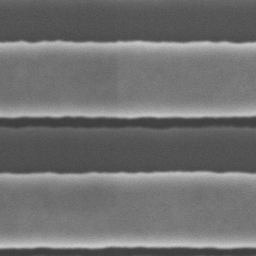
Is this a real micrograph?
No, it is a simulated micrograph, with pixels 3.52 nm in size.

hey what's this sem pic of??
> lines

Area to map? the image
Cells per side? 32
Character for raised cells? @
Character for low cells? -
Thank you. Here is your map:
--------------------------------
--------------------------------
--------------------------------
--------------------------------
--------------------------------
@@@@@@@@@@@@@@@@@@@@@@@@@@@@@@@@
@@@@@@@@@@@@@@@@@@@@@@@@@@@@@@@@
@@@@@@@@@@@@@@@@@@@@@@@@@@@@@@@@
@@@@@@@@@@@@@@@@@@@@@@@@@@@@@@@@
@@@@@@@@@@@@@@@@@@@@@@@@@@@@@@@@
@@@@@@@@@@@@@@@@@@@@@@@@@@@@@@@@
@@@@@@@@@@@@@@@@@@@@@@@@@@@@@@@@
@@@@@@@@@@@@@@@@@@@@@@@@@@@@@@@@
@@@@@@@@@@@@@@@@@@@@@@@@@@@@@@@@
@@@@@@@@@@@@@@@@@@@@@@@@@@@@@@@@
--------------------------------
--------------------------------
--------------------------------
--------------------------------
--------------------------------
--------------------------------
---------------------@@-@@@-----
@@@@@@@@@@@@@@@@@@@@@@@@@@@@@@@@
@@@@@@@@@@@@@@@@@@@@@@@@@@@@@@@@
@@@@@@@@@@@@@@@@@@@@@@@@@@@@@@@@
@@@@@@@@@@@@@@@@@@@@@@@@@@@@@@@@
@@@@@@@@@@@@@@@@@@@@@@@@@@@@@@@@
@@@@@@@@@@@@@@@@@@@@@@@@@@@@@@@@
@@@@@@@@@@@@@@@@@@@@@@@@@@@@@@@@
@@@@@@@@@@@@@@@@@@@@@@@@@@@@@@@@
@@@@@@@@@@@@@@@@@@@@@@@@@@@@@@@@
--------------------------------